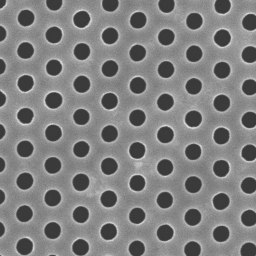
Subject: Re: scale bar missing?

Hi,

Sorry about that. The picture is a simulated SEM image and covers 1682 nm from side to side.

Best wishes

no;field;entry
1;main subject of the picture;a regular array of holes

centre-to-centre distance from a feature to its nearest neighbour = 212 nanometres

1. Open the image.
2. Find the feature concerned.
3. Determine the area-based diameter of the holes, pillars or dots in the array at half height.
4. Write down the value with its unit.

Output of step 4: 108 nanometres